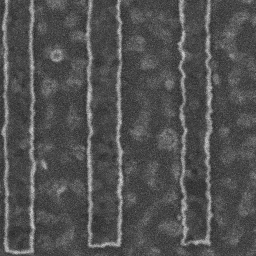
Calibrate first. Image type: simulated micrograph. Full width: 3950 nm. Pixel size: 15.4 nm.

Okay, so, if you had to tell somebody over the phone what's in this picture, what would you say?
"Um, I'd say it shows one or a few lines or trenches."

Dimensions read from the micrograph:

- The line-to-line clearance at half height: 58.9 pixels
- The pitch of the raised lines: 1.37 microns